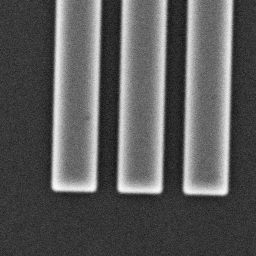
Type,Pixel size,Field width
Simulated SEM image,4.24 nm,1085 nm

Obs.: groups of lines, slits or small figures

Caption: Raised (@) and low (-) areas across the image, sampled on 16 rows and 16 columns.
----@@--@@--@@--
----@@--@@--@@--
----@@--@@--@@--
----@@--@@--@@--
---@@@--@@--@@--
---@@@--@@--@@--
---@@@--@@--@@--
---@@@-@@@--@@--
---@@@-@@@--@@--
---@@@-@@@--@@--
---@@@-@@@--@@--
---@@@-@@@--@@--
----------------
----------------
----------------
----------------